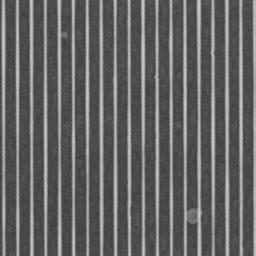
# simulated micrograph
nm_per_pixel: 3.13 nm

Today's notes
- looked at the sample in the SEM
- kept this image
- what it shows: parallel lines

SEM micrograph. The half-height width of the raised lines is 7.8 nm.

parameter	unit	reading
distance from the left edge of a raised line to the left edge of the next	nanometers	43.7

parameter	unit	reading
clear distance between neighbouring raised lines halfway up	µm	0.0368